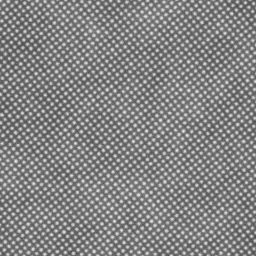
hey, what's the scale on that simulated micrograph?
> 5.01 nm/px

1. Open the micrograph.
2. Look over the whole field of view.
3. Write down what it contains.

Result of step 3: a regular array of raised bodies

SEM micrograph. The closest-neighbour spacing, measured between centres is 0.0272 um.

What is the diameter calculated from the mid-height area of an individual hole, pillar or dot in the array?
15 nm